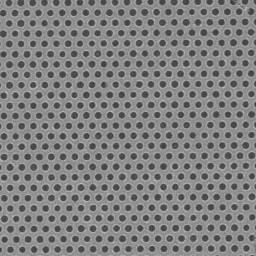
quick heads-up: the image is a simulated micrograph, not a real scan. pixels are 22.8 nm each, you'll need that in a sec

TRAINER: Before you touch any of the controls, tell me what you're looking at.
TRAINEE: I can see a regular array of holes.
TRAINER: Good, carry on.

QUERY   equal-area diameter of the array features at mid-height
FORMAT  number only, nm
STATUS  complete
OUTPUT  162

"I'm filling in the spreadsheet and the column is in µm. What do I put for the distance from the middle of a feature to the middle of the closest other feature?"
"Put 0.26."